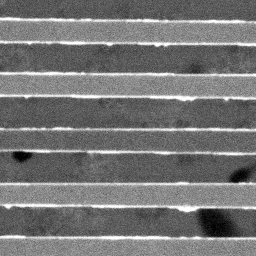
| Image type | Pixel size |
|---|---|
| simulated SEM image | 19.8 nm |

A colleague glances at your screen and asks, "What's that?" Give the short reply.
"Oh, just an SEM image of lines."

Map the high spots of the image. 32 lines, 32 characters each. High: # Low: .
................................
................................
############....................
################################
################################
...................##.........##
................................
................................
................................
################################
################################
################################
................................
................................
................................
................................
################################
################################
################################
................................
................................
................................
................................
################################
################################
################################
................................
................................
................................
................................
################################
################################